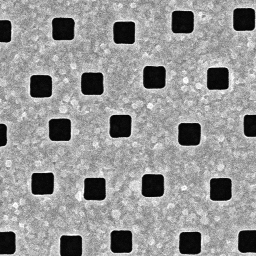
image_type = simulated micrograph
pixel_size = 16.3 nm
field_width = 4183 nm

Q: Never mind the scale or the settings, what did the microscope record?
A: a regular array of holes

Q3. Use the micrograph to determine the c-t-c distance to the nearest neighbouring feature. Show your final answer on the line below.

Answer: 0.951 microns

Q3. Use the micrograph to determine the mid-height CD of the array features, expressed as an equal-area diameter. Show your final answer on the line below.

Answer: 0.407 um